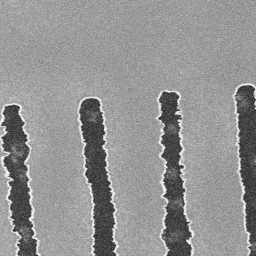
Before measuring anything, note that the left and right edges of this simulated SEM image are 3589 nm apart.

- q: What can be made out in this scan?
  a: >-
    one or a few lines or trenches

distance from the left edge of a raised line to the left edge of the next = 1080 nm